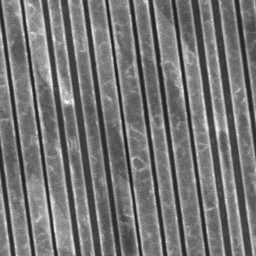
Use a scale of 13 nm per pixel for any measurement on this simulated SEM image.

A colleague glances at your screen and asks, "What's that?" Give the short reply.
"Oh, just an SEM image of parallel lines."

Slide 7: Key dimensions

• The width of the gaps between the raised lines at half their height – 64.5 nm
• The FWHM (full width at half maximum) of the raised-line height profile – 0.205 microns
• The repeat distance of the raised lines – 278 nm